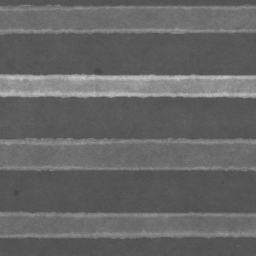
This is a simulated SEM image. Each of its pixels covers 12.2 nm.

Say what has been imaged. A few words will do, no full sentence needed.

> lines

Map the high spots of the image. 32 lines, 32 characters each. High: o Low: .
................................
oooooooooooooooooooooooooooooooo
oooooooooooooooooooooooooooooooo
oooooooooooooooooooooooooooooooo
................................
................................
................................
................................
................................
oooooooooooooooooooooooooooooooo
oooooooooooooooooooooooooooooooo
oooooooooooooooooooooooooooooooo
................................
................................
................................
................................
................................
................o...............
oooooooooooooooooooooooooooooooo
oooooooooooooooooooooooooooooooo
oooooooooooooooooooooooooooooooo
................................
................................
................................
................................
................................
................................
oooooooooooooooooooooooooooooooo
oooooooooooooooooooooooooooooooo
oooooooooooooooooooooooooooooo.o
................................
................................